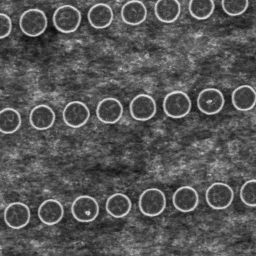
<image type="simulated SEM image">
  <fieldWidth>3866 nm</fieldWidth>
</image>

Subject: a regular array of raised bodies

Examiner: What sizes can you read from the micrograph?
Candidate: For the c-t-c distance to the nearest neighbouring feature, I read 508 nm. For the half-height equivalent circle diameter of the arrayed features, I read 0.376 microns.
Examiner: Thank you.